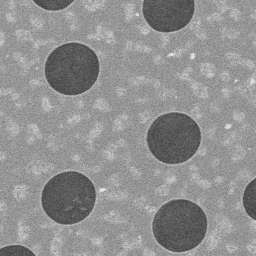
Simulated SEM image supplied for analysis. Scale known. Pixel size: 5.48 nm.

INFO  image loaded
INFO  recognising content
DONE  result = holes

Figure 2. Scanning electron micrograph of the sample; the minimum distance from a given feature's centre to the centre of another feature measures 554 nanometers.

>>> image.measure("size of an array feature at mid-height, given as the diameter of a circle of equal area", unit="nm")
296